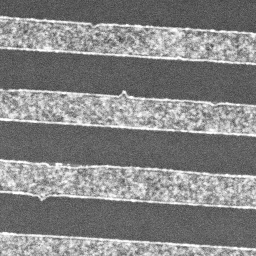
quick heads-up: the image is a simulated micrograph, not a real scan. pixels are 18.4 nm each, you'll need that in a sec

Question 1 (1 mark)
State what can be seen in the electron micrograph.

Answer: one or a few lines or trenches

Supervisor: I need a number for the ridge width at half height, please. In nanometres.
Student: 538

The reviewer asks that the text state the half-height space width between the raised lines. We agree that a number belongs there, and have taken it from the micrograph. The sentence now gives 0.76 micrometres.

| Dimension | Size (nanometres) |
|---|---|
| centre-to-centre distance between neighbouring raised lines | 1310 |